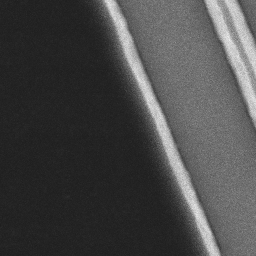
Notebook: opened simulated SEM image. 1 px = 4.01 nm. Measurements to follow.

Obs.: one or a few lines or trenches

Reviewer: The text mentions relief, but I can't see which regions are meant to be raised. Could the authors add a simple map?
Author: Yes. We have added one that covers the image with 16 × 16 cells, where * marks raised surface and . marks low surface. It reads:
*******......**.
********......*.
********......**
********.......*
*********......*
*********......*
**********......
**********......
**********......
***********.....
***********.....
************....
************....
*************...
*************...
*************...